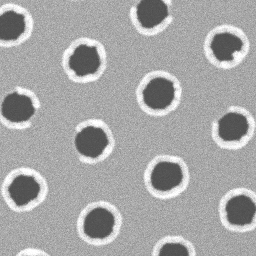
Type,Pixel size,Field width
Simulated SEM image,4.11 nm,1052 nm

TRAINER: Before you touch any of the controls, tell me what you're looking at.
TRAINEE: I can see a regular array of holes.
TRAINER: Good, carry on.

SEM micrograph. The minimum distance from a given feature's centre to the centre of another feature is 334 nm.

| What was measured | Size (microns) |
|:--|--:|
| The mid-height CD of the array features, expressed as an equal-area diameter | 0.129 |